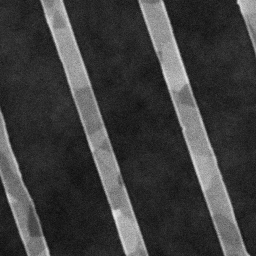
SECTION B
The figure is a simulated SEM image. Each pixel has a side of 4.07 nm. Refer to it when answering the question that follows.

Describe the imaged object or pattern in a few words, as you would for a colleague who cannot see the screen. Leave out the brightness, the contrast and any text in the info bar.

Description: one or a few lines or trenches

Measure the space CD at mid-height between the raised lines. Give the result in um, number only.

0.3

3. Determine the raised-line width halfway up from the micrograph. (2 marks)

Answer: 79.9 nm